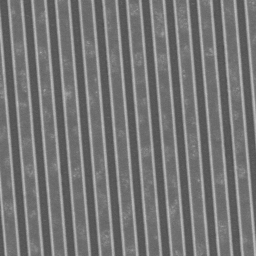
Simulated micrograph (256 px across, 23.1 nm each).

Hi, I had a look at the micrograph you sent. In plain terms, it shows parallel lines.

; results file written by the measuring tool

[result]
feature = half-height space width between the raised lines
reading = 225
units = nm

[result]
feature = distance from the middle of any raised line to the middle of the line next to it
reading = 0.546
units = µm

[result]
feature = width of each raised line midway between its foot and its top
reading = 314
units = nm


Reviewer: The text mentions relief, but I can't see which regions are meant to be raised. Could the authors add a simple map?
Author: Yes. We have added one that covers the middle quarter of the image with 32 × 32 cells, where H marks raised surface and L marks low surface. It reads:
HHHLLHHHHLLHHHLLLHHHLLLHHHLLLHHH
HHHLLHHHHLLHHHLLLHHHHLLHHHLLLHHH
HHHLLLHHHLLHHHHLLHHHHLLHHHLLLHHH
HHHLLLHHHLLHHHHLLHHHHLLHHHHLLHHH
HHHLLLHHHLLLHHHLLLHHHLLHHHHLLHHH
HHHLLLHHHLLLHHHLLLHHHLLHHHHLLHHH
HHHLLLHHHLLLHHHLLLHHHLLLHHHLLHHH
HHHLLLHHHLLLHHHLLLHHHLLLHHHLLHHH
HHHLLLHHHLLLHHHLLLHHHLLLHHHLLLHH
HHHLLLHHHLLLHHHLLLHHHLLLHHHLLLHH
HHHLLLHHHLLLHHHLLLHHHLLLHHHLLLHH
HHHLLLHHHLLLHHHLLLHHHLLLHHHLLLHH
HHHLLLHHHHLLHHHLLLHHHLLLHHHLLLHH
HHHHLLHHHHLLHHHLLLHHHHLLHHHLLLHH
HHHHLLLHHHLLHHHHLLHHHHLLHHHLLLHH
LHHHLLLHHHLLHHHHLLHHHHLLHHHLLLHH
LHHHLLLHHHLLHHHHLLLHHHLLHHHHLLHH
LHHHLLLHHHLLLHHHLLLHHHLLHHHHLLHH
LHHHLLLHHHLLLHHHLLLHHHLLLHHHLLHH
LHHHLLLHHHLLLHHHLLLHHHLLLHHHLLHH
LHHHLLLHHHLLLHHHLLLHHHLLLHHHLLLH
LHHHLLLHHHLLLHHHLLLHHHLLLHHHLLLH
LHHHLLLHHHLLLHHHLLLHHHLLLHHHLLLH
LHHHLLLHHHLLLHHHLLLHHHLLLHHHLLLH
LHHHLLLHHHHLLHHHLLLHHHLLLHHHLLLH
LHHHHLLHHHHLLHHHLLLHHHLLLHHHLLLH
LHHHHLLHHHHLLHHHHLLHHHHLLHHHLLLH
LLHHHLLLHHHLLHHHHLLHHHHLLHHHLLLH
LLHHHLLLHHHLLHHHHLLLHHHLLHHHHLLH
LLHHHLLLHHHLLLHHHLLLHHHLLHHHHLLH
LLHHHLLLHHHLLLHHHLLLHHHLLHHHHLLH
LLHHHLLLHHHLLLHHHLLLHHHLLLHHHLLH